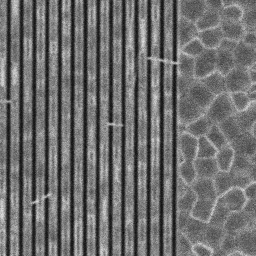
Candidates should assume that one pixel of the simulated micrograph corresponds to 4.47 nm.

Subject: parallel lines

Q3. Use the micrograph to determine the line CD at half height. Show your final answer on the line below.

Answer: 37.5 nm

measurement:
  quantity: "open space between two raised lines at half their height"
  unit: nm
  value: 20.7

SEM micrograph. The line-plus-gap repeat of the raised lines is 57.1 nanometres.